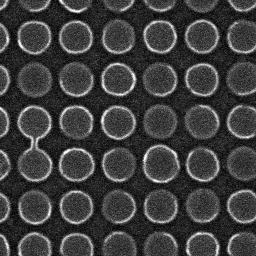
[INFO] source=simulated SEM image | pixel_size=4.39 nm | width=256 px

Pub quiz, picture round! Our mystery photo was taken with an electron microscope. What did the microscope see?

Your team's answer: a regular array of raised bodies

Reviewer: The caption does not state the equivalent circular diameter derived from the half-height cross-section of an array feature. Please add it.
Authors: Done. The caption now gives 140 nanometres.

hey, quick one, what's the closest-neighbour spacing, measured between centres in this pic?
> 0.183 um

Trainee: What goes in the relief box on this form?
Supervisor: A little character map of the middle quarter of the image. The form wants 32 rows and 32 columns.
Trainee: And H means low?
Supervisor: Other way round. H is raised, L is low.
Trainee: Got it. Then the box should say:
LHHHHLLLLLLHHHHHLLLLLLHHHHLLLLLL
HHHHHHLLLLHHHHHHHLLLLHHHHHHLLLLH
HHHHHHHLLLHHHHHHHLLLHHHHHHHHLLLH
HHHHHHHLLLHHHHHHHHLLHHHHHHHHLLHH
HHHHHHHLLLHHHHHHHHLLHHHHHHHHLLHH
HHHHHHHLLLHHHHHHHLLLHHHHHHHHLLLH
HHHHHHLLLLHHHHHHHLLLLHHHHHHLLLLH
LHHHHLLLLLLLHHHLLLLLLLHHHHLLLLLL
LLLLLLLLLLLLLLLLLLLLLLLLLLLLLLLL
LLLLLLLLLLLLLLLLLLLLLLLLLLLLLLLL
LLLLLLLLLLLLLLLLLLLLLLLHHLLLLLLL
HHHHHHLLLLLHHHHHLLLLLHHHHHHLLLLL
HHHHHHHLLLHHHHHHHLLLLHHHHHHLLLLH
HHHHHHHLLLHHHHHHHHLLHHHHHHHHLLHH
HHHHHHHLLHHHHHHHHHLLHHHHHHHHLLLH
HHHHHHHLLLHHHHHHHHLLHHHHHHHHLLLH
HHHHHHHLLLHHHHHHHLLLLHHHHHHHLLLH
LHHHHHLLLLLHHHHHHLLLLHHHHHHLLLLL
LLLLLLLLLLLLHHHLLLLLLLLLLLLLLLLL
LLLLLLLLLLLLLLLLLLLLLLLLLLLLLLLL
LLLLLLLLLLLLLLLLLLLLLLLHHLLLLLLL
LHHHHLLLLLLLHHHHLLLLLHHHHHHLLLLL
HHHHHHLLLLHHHHHHHLLLHHHHHHHHLLLH
HHHHHHHLLLHHHHHHHLLLHHHHHHHHLLLH
HHHHHHHLLLHHHHHHHHLLHHHHHHHHHLLH
HHHHHHHLLLHHHHHHHHLLHHHHHHHHHLLH
HHHHHHHLLLHHHHHHHLLLHHHHHHHHHLLH
HHHHHHHLLLHHHHHHHLLLHHHHHHHHLLLH
LHHHHHLLLLLHHHHHLLLLLHHHHHHLLLLL
LLLLLLLLLLLLLLLLLLLLLLLHHLLLLLLL
LLLLLLLLLLLLLLLLLLLLLLLLLLLLLLLL
LLLLLLLLLLLLLLLLLLLLLLLLLLLLLLLL